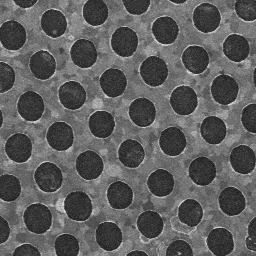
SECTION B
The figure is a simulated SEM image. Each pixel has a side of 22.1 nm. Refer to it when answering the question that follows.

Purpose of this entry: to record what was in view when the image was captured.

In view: a regular array of holes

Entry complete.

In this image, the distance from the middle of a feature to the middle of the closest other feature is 925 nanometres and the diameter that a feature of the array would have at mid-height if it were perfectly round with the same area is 633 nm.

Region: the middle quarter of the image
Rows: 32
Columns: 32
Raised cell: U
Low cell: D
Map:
UUUDDDDUUUUUUUUUUUUDDDDDDDUUUUDD
UUUUUUUUUUUDDDUUUUUDDDDDDDUUUUUD
UUUUUUUUUUDDDDDUUUUDDDDDDDUUUUUU
UUUUUUUUUDDDDDDDUUUDDDDDDDUUUUUU
DDDDUUUUUDDDDDDDUUUUDDDDDUUUUUUU
DDDDDUUUUDDDDDDDUUUUUDDDUUUUUDDU
DDDDDUUUUUDDDDDUUUUUUUUUUUUDDDDD
DDDDDDUUUUDDDDDUUUUUUUUUUUUDDDDD
DDDDDDUUUUUUDUUUUUUDDUUUUUDDDDDD
DDDDDUUUUUUUUUUUUDDDDDUUUUDDDDDD
DDDDDUUUUUUUUUUUDDDDDDDUUUUDDDDD
UUDUUUUUUUUUUUUUDDDDDDDUUUUDDDDD
UUUUUUUDDDDDUUUUDDDDDDDUUUUUDDDD
UUUUUUDDDDDDUUUUDDDDDDDUUUUUUUUU
UUUUUUDDDDDDDUUUUDDDDDUUUUUUUUUU
DUUUUUDDDDDDDUUUUUDDDUUUUUUUUUUU
DDUUUUDDDDDDUUUUUUUUUUUUUDDDDUUU
DDUUUUUDDDDDUUUUUUUUUUUUDDDDDDUU
DDUUUUUUUDUUUUUUUUUUUUUUDDDDDDUU
DDUUUUUUUUUUUUDDDDDUUUUUDDDDDDDU
DDUUUUUUUUUUUUDDDDDUUUUUDDDDDDDU
DUUUUUDUUUUUUUDDDDDDUUUUDDDDDDUU
UUUUDDDDUUUUUDDDDDDDUUUUUDDDDUUU
UUUDDDDDDUUUUUDDDDDDUUUUUUUUUUUU
UUUDDDDDDDUUUUDDDDDDUUUUUUUUUUUU
UUUDDDDDDDUUUUUDDDDUUUUUUUUUUUUD
UUUDDDDDDDUUUUUUUUUUUUUDDUUUUUUD
UUUUDDDDDUUUUUUUUUUUUUDDDDDUUUUD
UUUUUDDDUUUUUUUUUUUUUDDDDDDDUUUU
UUUUUUUUUUUUUDDUUUUUUDDDDDDDUUUU
UUUUUUUUUUUDDDDDUUUUUDDDDDDDUUUU
UUUUUUUUUUUDDDDDDUUUUDDDDDDUUUUU